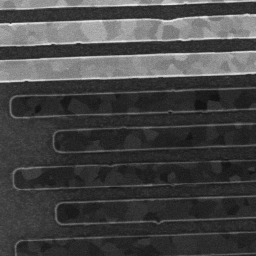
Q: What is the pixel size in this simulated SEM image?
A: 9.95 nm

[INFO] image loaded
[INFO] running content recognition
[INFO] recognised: parallel lines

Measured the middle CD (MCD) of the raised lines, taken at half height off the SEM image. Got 21.4 pixels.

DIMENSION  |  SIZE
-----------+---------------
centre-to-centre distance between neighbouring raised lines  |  359 nanometers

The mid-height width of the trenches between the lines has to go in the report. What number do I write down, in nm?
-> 146